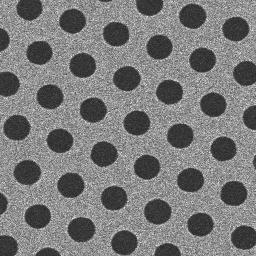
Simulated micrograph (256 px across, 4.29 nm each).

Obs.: a regular array of holes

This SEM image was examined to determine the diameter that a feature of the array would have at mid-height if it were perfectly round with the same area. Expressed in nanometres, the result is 111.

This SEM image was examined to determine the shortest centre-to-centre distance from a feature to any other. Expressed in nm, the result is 193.